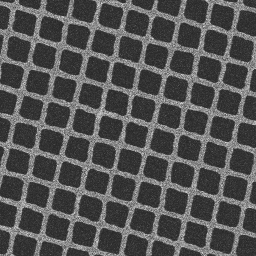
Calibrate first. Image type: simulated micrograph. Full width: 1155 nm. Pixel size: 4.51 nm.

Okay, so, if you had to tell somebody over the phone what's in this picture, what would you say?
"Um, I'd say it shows a regular array of holes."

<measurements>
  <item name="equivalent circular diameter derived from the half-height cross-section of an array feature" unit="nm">111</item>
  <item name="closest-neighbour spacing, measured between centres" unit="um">0.121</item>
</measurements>